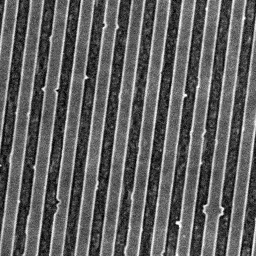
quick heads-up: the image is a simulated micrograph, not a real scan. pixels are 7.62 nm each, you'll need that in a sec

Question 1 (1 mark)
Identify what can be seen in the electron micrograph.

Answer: parallel lines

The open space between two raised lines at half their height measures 0.0907 µm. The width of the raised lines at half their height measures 0.0983 micrometres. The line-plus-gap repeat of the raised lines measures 191 nanometers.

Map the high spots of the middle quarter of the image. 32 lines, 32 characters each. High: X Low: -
--XXX----XXX---XXX---XXX----XXX-
--XXX---XXXX---XXX---XXX----XXX-
--XXX---XXXX---XXX---XXX---XXX--
--XXX---XXXX--XXXX---XXX---XXX--
--XXX---XXX---XXXX---XXX---XXX--
--XXX---XXX---XXXX---XXX---XXX--
--XXX---XXX---XXX----XXX---XXX--
-XXXX---XXX---XXX---XXXX---XXX--
-XXX----XXX---XXX---XXX----XXX--
-XXX---XXXX---XXX---XXX----XXX--
-XXX---XXXX---XXX---XXX---XXX---
-XXX---XXXX--XXXX---XXX---XXX---
-XXX---XXX---XXXX---XXX---XXX---
-XXX---XXX---XXXX---XXX---XXX---
-XXX---XXX---XXX----XXX---XXX---
XXXX---XXX---XXX---XXXX---XXX---
XXX----XXX---XXX---XXX----XXX---
XXX---XXXX---XXX---XXX----XXX---
XXX---XXXX---XXX---XXX---XXX----
XXX---XXXX--XXXX---XXX---XXX----
XXX---XXX---XXXX---XXX---XXX---X
XXX---XXX---XXXX---XXX---XXX---X
XXX---XXX---XXX----XXX---XXX---X
XXX---XXX---XXX---XXXX---XXX---X
XX----XXX---XXX---XXX----XXX---X
XX---XXXX---XXX---XXX----XXX---X
XX---XXXX---XXX---XXX---XXX----X
XX---XXXX---XXX---XXX---XXX----X
XX---XXX---XXXX---XXX---XXX---XX
XX---XXXX--XXXX---XXX---XXX---XX
XX---XXX---XXX----XXX---XXX---XX
XX---XXX---XXX---XXXX---XXX---XX